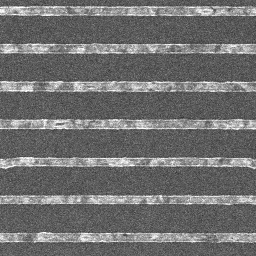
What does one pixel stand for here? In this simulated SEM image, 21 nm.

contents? parallel lines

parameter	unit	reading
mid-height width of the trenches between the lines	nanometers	623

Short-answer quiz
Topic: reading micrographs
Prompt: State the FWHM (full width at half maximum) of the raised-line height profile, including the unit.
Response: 179 nanometres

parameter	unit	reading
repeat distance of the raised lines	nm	793